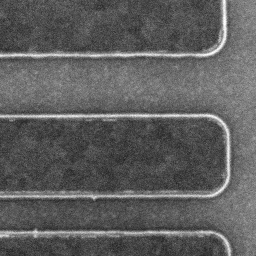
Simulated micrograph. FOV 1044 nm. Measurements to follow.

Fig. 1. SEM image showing one or a few lines or trenches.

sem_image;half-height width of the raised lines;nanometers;330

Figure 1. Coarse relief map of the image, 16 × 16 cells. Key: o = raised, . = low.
oooooooooooooo..
oooooooooooooo..
oooooooooooooo..
................
................
................
................
oooooooooooooo..
oooooooooooooo..
oooooooooooooo..
oooooooooooooo..
oooooooooooooo..
................
................
................
oooooooooooooo..